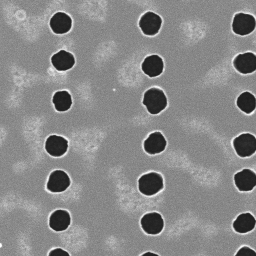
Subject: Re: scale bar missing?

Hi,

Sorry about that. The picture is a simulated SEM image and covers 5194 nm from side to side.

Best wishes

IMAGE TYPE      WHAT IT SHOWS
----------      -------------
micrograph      a regular array of holes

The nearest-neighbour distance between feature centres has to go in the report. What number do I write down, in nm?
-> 790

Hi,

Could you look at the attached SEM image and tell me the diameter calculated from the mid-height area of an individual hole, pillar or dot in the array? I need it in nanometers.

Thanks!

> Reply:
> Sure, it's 450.